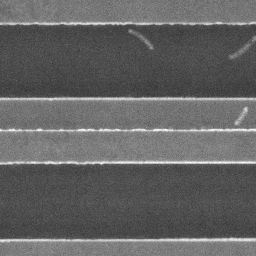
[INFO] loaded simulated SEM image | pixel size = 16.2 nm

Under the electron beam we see lines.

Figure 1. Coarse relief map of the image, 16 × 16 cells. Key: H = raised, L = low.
HHHHHHHHHHHHHHHH
LLLLLLLLLLLLLLLL
LLLLLLLLLLLLLLLL
LLLLLLLLLLLLLLLL
LLLLLLLLLLLLLLLL
LLLLLLLLLLLLLLLL
HHHHHHHHHHHHHHHH
HHHHHHHHHHHHHHHH
HHHHHHHHHHHHHHHH
HHHHHHHHHHHHHHHH
LLLLLLLLLLLLLLLL
LLLLLLLLLLLLLLLL
LLLLLLLLLLLLLLLL
LLLLLLLLLLLLLLLL
LLLLLLLLLLLLLLLL
HHHHHHHHHHHHHHHH